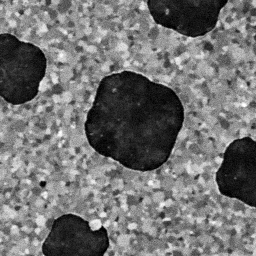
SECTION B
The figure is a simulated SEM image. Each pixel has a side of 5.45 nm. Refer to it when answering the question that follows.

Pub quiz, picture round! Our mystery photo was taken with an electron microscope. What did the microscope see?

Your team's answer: holes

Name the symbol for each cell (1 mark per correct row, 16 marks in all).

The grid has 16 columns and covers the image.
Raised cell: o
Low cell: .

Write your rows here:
ooooooooo.....oo
oooooooooo...ooo
.ooooooooooooooo
...ooooooooooooo
...oooo.oooooooo
..oooo.....ooooo
oooooo.....ooooo
ooooo......ooooo
ooooo......ooooo
oooooo.....ooo..
oooooooo..oooo..
oooooooooooooo..
ooooooooooooooo.
oooo.ooooooooooo
ooo....ooooooooo
ooo....ooooooooo